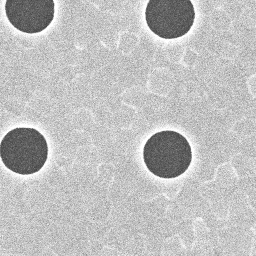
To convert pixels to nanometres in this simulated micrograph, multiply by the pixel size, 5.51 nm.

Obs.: holes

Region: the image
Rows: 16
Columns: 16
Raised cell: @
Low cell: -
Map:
---@@@@@@---@@@@
@--@@@@@@---@@@@
@@@@@@@@@@@@@@@@
@@@@@@@@@@@@@@@@
@@@@@@@@@@@@@@@@
@@@@@@@@@@@@@@@@
@@@@@@@@@@@@@@@@
@@@@@@@@@@@@@@@@
---@@@@@@@-@@@@@
---@@@@@@---@@@@
@--@@@@@@---@@@@
@@@@@@@@@@@@@@@@
@@@@@@@@@@@@@@@@
@@@@@@@@@@@@@@@@
@@@@@@@@@@@@@@@@
@@@@@@@@@@@@@@@@